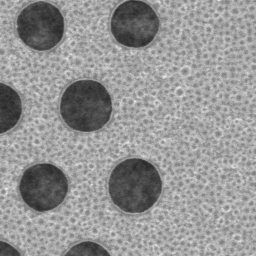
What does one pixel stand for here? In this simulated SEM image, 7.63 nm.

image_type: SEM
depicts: holes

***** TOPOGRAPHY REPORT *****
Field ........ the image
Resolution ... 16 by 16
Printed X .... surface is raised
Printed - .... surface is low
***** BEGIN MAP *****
XX--XXX--XXXXXXX
X---XXX---XXXXXX
X---XXX---XXXXXX
XXXXXXXXXXXXXXXX
XXXXXXXXXXXXXXXX
-XXX---XXXXXXXXX
-XXX---XXXXXXXXX
-XXX---XXXXXXXXX
XXXXXXXXXXXXXXXX
XXXXXXXXXXXXXXXX
XX--XXX---XXXXXX
X---XXX---XXXXXX
X---XXX---XXXXXX
XXXXXXXXXXXXXXXX
XXXXXXXXXXXXXXXX
-XXX--XXXXXXXXXX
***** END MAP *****